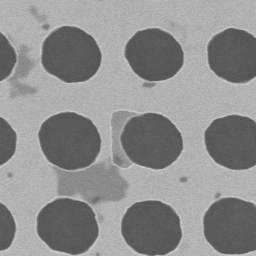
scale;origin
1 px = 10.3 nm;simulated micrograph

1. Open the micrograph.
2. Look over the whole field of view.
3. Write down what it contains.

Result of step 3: holes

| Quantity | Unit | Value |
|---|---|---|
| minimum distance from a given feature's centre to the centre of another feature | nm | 855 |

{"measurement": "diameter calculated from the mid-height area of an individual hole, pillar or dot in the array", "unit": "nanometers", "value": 602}